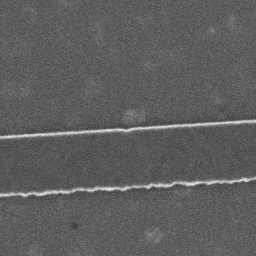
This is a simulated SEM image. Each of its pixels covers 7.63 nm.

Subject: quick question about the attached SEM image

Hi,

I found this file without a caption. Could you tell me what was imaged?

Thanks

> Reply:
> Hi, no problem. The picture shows one or a few lines or trenches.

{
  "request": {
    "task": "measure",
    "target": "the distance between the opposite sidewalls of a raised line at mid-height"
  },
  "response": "449 nm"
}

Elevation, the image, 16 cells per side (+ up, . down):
................
................
................
................
................
................
................
................
.+++++++++++++++
++++++++++++++++
++++++++++++++++
+++++++++++.....
................
................
................
................